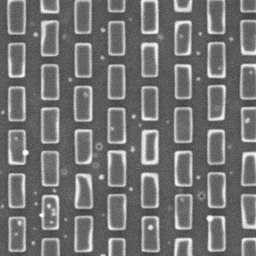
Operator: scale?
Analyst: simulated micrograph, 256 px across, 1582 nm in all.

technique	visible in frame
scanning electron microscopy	groups of lines, slits or small figures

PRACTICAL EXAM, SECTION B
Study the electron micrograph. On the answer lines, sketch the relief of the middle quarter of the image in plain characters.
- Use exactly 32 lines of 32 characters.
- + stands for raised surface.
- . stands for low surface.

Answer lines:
...++++....++++.....+++.....++..
...++++....++++.....+++.....+++.
...++++....++++.....+++.....+++.
...........++++.............++++
...........++++.............++++
...........++++.............++++
...++++....++++....++++.....++++
...++++....++++....++++.....++++
...++++....++++....++++.....+++.
...++++.............+++.........
...++++.............+++.........
...++++....++++.....+++.....++++
...++++....++++.....+++.....++++
...++++....++++.....+++.....++++
...........++++.............++++
...........++++.............++++
...........++++.............++++
...++++....++++.....+++.....++++
...++++....++++.....+++.....++++
...++++....++++.....+++.....+++.
...++++.............+++.........
...++++.............+++.........
...++++....++++.....+++.....++++
...++++....++++.....+++.....++++
...+++.....++++.....+++.....++++
...........++++.............++++
...........++++.............++++
...........++++.............++++
...+++.....++++....++++.....++++
...++++....++++....++++.....++++
...++++............++++.........
...++++............++++.........